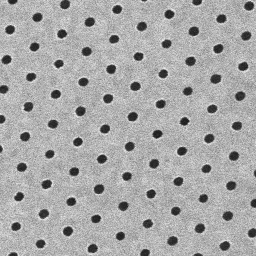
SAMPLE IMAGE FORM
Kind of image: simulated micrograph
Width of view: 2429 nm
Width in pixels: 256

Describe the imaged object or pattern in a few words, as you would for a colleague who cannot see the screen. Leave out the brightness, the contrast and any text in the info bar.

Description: a regular array of holes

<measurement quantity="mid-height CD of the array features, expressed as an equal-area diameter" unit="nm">92.1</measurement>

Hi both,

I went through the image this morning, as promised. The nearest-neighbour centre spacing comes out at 283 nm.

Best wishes